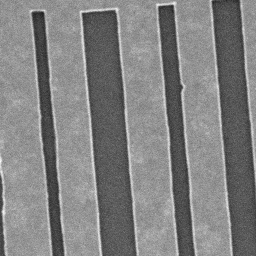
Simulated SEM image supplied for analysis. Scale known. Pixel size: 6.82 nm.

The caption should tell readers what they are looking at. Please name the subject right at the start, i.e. one or a few lines or trenches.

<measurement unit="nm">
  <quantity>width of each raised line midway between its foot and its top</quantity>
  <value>248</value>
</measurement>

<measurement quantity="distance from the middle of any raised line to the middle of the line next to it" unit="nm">434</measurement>